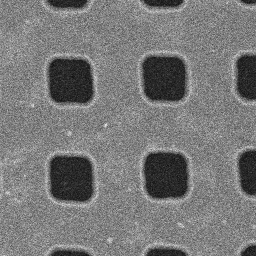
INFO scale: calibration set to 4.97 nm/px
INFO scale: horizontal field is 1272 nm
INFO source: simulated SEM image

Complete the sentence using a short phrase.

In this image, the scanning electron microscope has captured holes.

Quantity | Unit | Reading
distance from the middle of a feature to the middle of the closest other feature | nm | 469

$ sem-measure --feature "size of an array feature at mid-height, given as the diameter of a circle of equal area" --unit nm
252